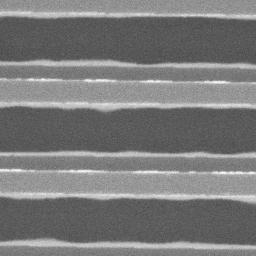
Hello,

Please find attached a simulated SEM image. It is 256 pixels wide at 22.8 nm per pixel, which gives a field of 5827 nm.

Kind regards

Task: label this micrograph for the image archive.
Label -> lines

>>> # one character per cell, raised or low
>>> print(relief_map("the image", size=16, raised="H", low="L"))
HHHHHHHHHHHHHHHH
LLLLLLLLLLLLLLLL
LLLLLLLLLLLLLLLL
LLLLLLLLLLLLLLLL
HHHHHHHHHHHHHHHH
HHHHHHHHHHHHHHHH
LLLHHHHHHHHHHHHH
LLLLLLLLLLLLLLLL
LLLLLLLLLLLLLLLL
LLLLLLLLLLLLLLLL
HHHHHHHHHHHHHHHH
HHHHHHHHHHHHHHHH
LLLLLLLLLLLLLLLL
LLLLLLLLLLLLLLLL
LLLLLLLLLLLLLLLL
HHHHHHHHHHHHHHLL